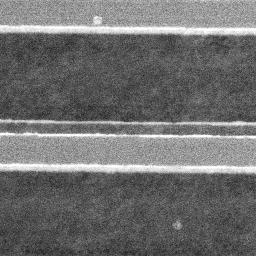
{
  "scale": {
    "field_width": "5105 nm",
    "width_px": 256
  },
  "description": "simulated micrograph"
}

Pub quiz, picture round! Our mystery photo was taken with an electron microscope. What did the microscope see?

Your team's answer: lines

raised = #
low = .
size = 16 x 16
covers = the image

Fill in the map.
################
################
................
................
................
................
................
................
################
################
................
................
................
................
................
................